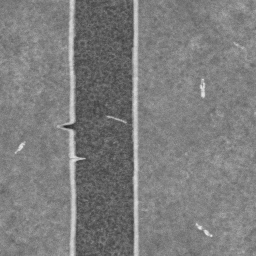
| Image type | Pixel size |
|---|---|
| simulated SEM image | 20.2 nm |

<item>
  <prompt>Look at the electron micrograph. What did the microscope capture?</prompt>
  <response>one or a few lines or trenches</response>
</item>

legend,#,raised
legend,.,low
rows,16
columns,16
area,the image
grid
####....########
####....########
####....########
####....########
####....########
####....########
####....########
####....########
####....########
#####...########
#####...########
#####...########
#####...########
#####...########
#####....#######
####....########